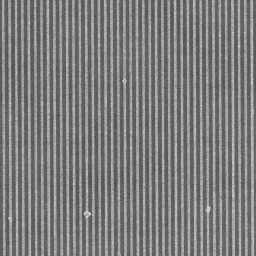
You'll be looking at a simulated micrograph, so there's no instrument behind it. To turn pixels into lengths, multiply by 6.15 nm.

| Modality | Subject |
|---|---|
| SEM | parallel lines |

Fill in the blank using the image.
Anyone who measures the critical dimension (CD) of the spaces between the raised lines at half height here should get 0.0284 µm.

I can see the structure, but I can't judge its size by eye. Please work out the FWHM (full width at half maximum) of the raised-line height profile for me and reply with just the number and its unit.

10 nanometers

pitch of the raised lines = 39.2 nm